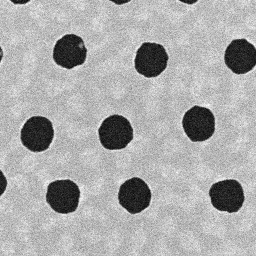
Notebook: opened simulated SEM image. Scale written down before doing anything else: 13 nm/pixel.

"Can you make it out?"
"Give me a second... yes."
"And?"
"a regular array of holes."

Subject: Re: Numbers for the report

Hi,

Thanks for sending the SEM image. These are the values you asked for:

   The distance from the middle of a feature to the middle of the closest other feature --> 0.938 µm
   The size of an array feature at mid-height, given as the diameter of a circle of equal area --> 452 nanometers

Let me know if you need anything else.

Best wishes